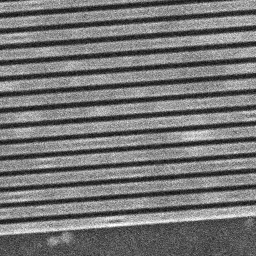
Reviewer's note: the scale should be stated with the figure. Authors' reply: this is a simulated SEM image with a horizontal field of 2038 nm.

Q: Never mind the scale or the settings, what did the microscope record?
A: parallel lines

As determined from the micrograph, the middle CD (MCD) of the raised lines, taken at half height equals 0.0803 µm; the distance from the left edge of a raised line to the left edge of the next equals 126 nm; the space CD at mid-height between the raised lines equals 0.0516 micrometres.